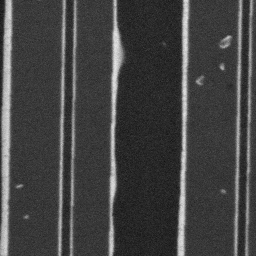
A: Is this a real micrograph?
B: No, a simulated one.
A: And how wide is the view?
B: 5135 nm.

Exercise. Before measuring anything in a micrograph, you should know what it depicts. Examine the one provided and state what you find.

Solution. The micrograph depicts lines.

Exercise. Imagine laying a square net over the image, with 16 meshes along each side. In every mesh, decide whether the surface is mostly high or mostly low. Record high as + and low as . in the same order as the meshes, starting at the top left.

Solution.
.++++++.....++++
.++++++.....++++
+++++++.....++++
+++++++.....++++
+++++++.....++++
+++++++.....++++
+++++++.....++++
+++++++.....++++
+++++++.....++++
+++++++....+++++
+++++++....+++++
+++++++....+++++
+++++++....+++++
+++++++....+++++
+++++++....+++++
+++++++....+++++